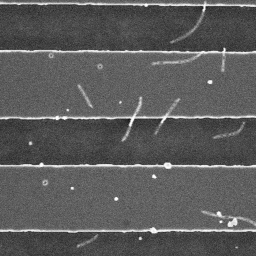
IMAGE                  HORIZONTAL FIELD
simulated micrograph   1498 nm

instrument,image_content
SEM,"lines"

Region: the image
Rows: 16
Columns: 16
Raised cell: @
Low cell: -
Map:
----------------
----------------
----------------
@@@@@@@@@@@@@@@@
@@@@@@@@@@@@@@@@
@@@@@@@@@@@@@@@@
@@@@@@@@@@@@@@@@
----------------
----------------
----------------
@@@@@@@@@@@@@@@@
@@@@@@@@@@@@@@@@
@@@@@@@@@@@@@@@@
@@@@@@@@@@@@@@@@
---------@------
----------------